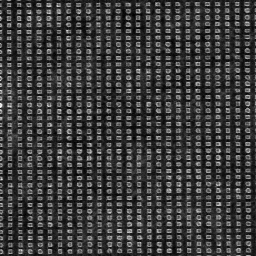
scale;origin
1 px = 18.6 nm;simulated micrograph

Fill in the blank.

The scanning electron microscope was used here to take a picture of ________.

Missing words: a regular array of raised bodies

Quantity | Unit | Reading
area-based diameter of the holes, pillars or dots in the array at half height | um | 0.0838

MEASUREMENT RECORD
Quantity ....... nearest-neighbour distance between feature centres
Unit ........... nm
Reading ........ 121